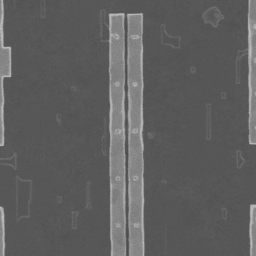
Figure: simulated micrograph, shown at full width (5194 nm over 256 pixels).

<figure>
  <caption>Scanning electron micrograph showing wiring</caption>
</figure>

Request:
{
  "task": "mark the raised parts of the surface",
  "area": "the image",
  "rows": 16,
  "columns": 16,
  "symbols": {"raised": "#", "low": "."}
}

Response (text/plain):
................
.......##.......
.......##.......
#......##.......
#......##.......
.......##.......
.......##.......
.......##.......
.......##.......
.......##.......
.......##.......
.......##.......
.......##.......
.......##.......
.......##.......
.......##.......